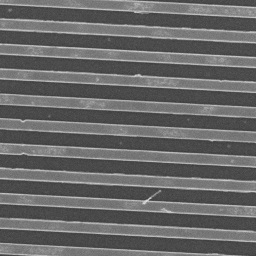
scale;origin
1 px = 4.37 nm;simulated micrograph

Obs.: parallel lines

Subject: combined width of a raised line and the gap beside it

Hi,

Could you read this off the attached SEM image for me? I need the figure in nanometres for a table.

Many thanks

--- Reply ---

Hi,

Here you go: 109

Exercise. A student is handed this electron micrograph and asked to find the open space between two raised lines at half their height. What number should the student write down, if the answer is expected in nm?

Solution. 66.6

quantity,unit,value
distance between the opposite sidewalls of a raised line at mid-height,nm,44.2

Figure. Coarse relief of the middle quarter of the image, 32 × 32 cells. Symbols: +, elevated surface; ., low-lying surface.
................................
................................
+++.............................
++++++++++++++++++++++++++......
.+++++++++++++++++++++++++++++++
....................++++++++++++
................................
................................
+...............................
+++++++++++++++++++.............
++++++++++++++++++++++++++++++++
.............+++++++++++++++++++
................................
................................
................................
+++++++++++++++++...............
++++++++++++++++++++++++++++++++
..........++++++++++++++++++++++
.............................+++
................................
................................
++++++++++++++..................
++++++++++++++++++++++++++++++++
.......+++++++++++++++++++++++++
..........................++++++
................................
................................
+++++++.........................
++++++++++++++++++++++++++......
....++++++++++++++++++++++++++++
...................+++++++++++++
................................